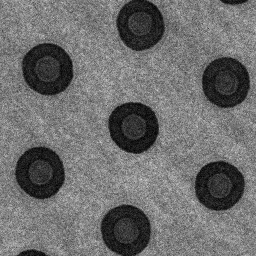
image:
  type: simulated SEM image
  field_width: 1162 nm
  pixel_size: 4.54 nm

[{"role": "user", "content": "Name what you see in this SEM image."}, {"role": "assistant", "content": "ring-shaped grooves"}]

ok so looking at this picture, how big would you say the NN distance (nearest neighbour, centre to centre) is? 467 nm